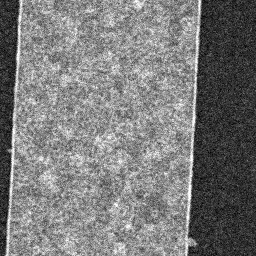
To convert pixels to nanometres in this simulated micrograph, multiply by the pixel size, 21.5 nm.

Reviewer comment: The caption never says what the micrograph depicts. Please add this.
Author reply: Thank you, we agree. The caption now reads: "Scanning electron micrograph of one or a few lines or trenches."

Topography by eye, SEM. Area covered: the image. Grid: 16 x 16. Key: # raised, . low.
.###########....
.###########....
.###########....
.###########....
.###########....
.###########....
.###########....
.###########....
.###########....
.###########....
.###########....
.###########....
.###########....
.###########....
.###########....
############....